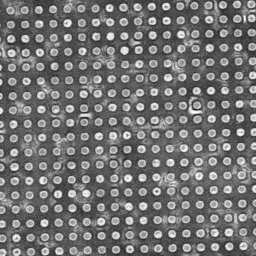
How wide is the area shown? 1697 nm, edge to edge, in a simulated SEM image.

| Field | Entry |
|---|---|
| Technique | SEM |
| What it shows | a regular array of raised bodies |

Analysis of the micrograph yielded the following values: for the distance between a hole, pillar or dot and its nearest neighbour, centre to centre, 92.5 nanometres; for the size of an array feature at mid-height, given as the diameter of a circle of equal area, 48.5 nanometers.